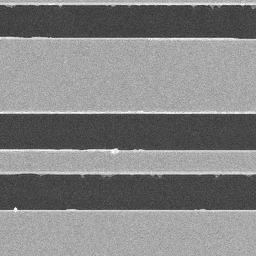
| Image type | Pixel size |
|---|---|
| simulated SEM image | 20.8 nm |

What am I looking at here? lines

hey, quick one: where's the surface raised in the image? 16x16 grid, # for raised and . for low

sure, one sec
................
................
################
################
################
################
################
................
................
################
################
................
................
################
################
################